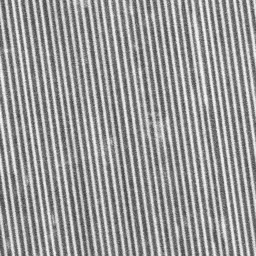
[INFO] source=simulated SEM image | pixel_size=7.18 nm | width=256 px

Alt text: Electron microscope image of parallel lines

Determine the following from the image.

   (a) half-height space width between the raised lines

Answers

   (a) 32.9 nm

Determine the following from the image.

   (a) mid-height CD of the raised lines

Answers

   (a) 13.3 nm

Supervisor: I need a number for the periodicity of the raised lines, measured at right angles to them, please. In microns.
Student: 0.0492